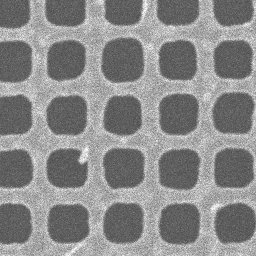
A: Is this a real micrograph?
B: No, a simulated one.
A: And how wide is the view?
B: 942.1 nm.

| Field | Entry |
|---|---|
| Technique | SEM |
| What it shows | a regular array of holes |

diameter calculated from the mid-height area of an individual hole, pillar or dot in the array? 0.158 um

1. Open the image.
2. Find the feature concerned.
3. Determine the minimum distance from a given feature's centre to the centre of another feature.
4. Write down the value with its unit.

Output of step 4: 53.7 px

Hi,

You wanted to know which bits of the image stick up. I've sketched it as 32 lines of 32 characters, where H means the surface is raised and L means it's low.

LLLLHHLLLLLHHLLLLLHHLLLLLHHLLLLL
LLLLHHLLLLLHHLLLLLHHLLLLLHHLLLLL
LLLLHHLLLLLHHLLLLHHHLLLLHHHLLLLH
LLLHHHHHHHHHHHHHHHHHHHHHHHHHHHHH
HHHHHHHHHHHHHHHHHHHHHHHHHHHHHHHH
LLLLHHHLLLHHHLLLLLHHLLLLHHHLLLLH
LLLLHHLLLLLHHLLLLLHHLLLLLHHLLLLL
LLLLHHLLLLLHHLLLLLHHLLLLLHHLLLLL
LLLLHHLLLLLHHLLLLLHHLLLLLHHLLLLL
LLLLHHLLLLHHHLLLLLHHLLLLHHHLLLLH
HHHHHHHHHHHHHHHHHHHHHHHHHHHHHHHH
HHHHHHHHHHHHHHHHHHHHHHHHHHHHHHHH
LLLLHHHLLLLHHHLLLHHHLLLLLHHLLLLL
LLLLHHLLLLLHHLLLLLHHLLLLLHHLLLLL
LLLLHHLLLLLHHLLLLLHHLLLLLHLLLLLL
LLLLHHLLLLLHHLLLLLHHLLLLLHHLLLLL
LLLHHHHLLLHHHHLLLHHHLLLLHHHLLLLH
HHHHHHHHHHHHHHHHHHHHHHHHHHHHHHHH
HHHHHHHHHHHHHHHHHHHHHHHHHHHHHHHH
LLLLHHLLLLHHHLLLLLHHLLLLLHHLLLLL
LLLLHHLLLLLHHLLLLLHHLLLLLHHLLLLL
LLLLHHLLLLLHHLLLLLHHLLLLLHHLLLLL
LLLLHHLLLLLHHLLLLLHHLLLLLHHLLLLL
HHHHHHHHHHHHHHLLHHHHHLLLHHHHHLHH
HHHHHHHHHHHHHHHHHHHHHHHHHHHHHHHH
HLLHHHHLLLHHHHLLLHHHHHLLHHHHHLLH
LLLLHHLLLLLHHLLLLLHHLLLLLHHLLLLL
LLLLHHLLLLLHHLLLLLHHLLLLLHHLLLLL
LLLLHHLLLLLHHLLLLLHHLLLLLHHLLLLL
LLLLHHLLLLLHHLLLLLHHLLLLLHHLLLLL
HHHHHHHHHHHHHHHHHHHHHHLHHHHHHHHH
HHHHHHHHHHHHHHHHHHHHHHHHHHHHHHHH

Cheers